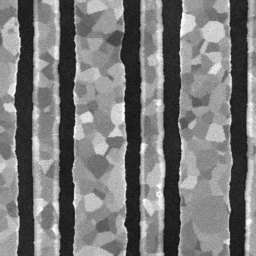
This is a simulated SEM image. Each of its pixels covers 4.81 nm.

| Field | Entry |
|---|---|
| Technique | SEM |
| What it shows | lines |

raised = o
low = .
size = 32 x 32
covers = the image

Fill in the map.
oo..ooo..oooooo...oo...oooooo..o
oo..ooo..oooooo...oo...oooooo..o
oo..ooo..ooooooo..oo...oooooo..o
oo..ooo..ooooooo..oo...oooooo..o
oo..ooo..oooooo...oo...oooooo..o
oo..ooo..oooooo...oo...oooooo..o
oo..ooo..oooooo...oo..ooooooo..o
oo..ooo...ooooo...oo...oooooo..o
oo..ooo...oooooo..oo...oooooo..o
oo..ooo..ooooooo..oo...oooooo..o
oo..ooo..ooooooo..oo...oooooo..o
oo..ooo..ooooooo..oo...oooooo..o
oo..ooo..ooooooo..oo..ooooooo..o
oo..ooo..ooooooo..oo..ooooooo..o
oo..ooo..ooooooo..oo..ooooooo..o
oo..ooo..ooooooo..oo..ooooooo..o
oo..ooo..ooooooo..oo..ooooooo..o
oo..ooo..ooooooo..oo...oooooo..o
oo..ooo..ooooooo..oo...oooooo..o
oo..ooo..ooooooo..oo...oooooo..o
oo..ooo..ooooooo..oo...oooooo..o
oo..ooo..ooooooo..oo..ooooooo..o
oo..ooo..ooooooo..oo..ooooooo..o
oo..ooo..ooooooo..oo..ooooooo..o
oo..ooo..ooooooo..oo..ooooooo..o
oo..ooo..ooooooo..oo...oooooo..o
oo..ooo..ooooooo..oo...oooooo..o
oo..ooo..ooooooo..oo...oooooo..o
oo..ooo..ooooooo..oo...oooooo..o
oo..ooo..ooooooo..oo..ooooooo..o
oo..ooo..ooooooo..oo..ooooooo..o
oo..ooo..ooooooo..oo..ooooooo..o